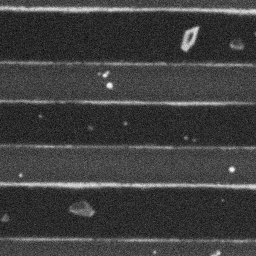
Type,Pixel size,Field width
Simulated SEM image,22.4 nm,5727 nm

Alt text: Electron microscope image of lines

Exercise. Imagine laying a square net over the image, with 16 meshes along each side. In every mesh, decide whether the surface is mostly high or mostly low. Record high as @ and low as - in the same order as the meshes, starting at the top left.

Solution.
----------------
@@@@@@@@@@@@@@@@
@@@@@@@@@@@@@@@@
@@@@@@@@@@@@@@@@
----------------
----------------
@@@@@@@@@@@@@@@@
@@@@@@@@@@@@@@@@
@@@@@@@@@@@@@@@@
----------------
----------------
@@@@------------
@@@@@@@@@@@@@@@@
@@@@@@@@@@@@@@@@
@@@@@@@@@@@@@@@@
----------------